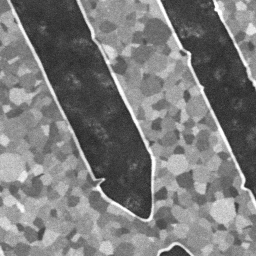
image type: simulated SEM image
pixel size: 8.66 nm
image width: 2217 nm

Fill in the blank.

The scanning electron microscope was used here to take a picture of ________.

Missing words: one or a few lines or trenches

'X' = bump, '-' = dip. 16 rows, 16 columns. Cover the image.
X----XXXXX----XX
X-----XXXXX---XX
XX----XXXXX----X
XX-----XXXXX---X
XXX----XXXXX----
XXX----XXXXXX---
XXXX----XXXXX---
XXXX----XXXXXX--
XXXXX----XXXXX--
XXXXX----XXXXX--
XXXXXX----XXXXX-
XXXXXX----XXXXX-
XXXXXXX---XXXXXX
XXXXXXXXXXXXXXXX
XXXXXXXXXXXXXXXX
XXXXXXXXXXXXXXXX